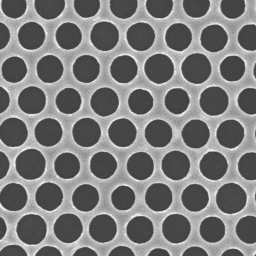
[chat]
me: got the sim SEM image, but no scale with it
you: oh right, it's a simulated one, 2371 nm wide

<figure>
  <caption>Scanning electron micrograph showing a regular array of holes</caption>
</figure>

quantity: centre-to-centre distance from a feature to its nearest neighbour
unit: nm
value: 331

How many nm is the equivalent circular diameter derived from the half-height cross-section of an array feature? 260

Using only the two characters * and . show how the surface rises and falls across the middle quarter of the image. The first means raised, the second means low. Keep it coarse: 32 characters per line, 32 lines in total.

**.......***......**.......**...
**.......**.......**........*...
**.......***......**.......***..
***.....****......***......***..
****...*******..******....*****.
********************************
...*****....******..******....**
....***......****.....****.....*
....***.......**......***......*
....**........**......***......*
....***.......**......***......*
....***......****.....****.....*
*.******....******..*******..***
*****.********.*****************
***.....****.....****.....*****.
**.......***......***......***..
**.......**.......**.......**...
**.......**.......**.......**...
**.......**.......**.......**...
***.....****.....****......***..
****...******...******....*****.
********************************
..******....*****....****.....**
....***......***......***......*
....**.......***......**........
....**.......***.......*........
....***......***......**.......*
...****.....****......***......*
..*******..******....*****....**
********************************
****...*******..*****.....*****.
***.....*****....****......***..